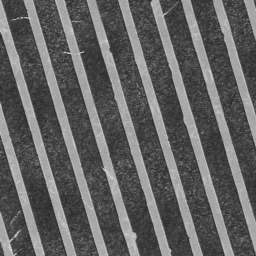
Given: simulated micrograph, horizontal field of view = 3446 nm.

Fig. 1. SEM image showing parallel lines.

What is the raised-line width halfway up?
0.111 micrometres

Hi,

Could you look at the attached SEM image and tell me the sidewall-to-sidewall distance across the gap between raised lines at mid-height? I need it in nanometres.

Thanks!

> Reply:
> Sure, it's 292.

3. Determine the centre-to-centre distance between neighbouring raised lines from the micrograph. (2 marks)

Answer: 407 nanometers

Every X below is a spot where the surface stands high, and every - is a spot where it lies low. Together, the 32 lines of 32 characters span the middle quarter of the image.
---XX------XX-----XXX-----XX----
---XX------XX------XX------XX---
---XX------XX------XX------XX---
---XXX------XX-----XX------XX---
----XX------XX------XX-----XXX--
----XX------XX------XX------XX--
----XXX-----XXX-----XX------XX--
-----XX------XX-----XXX-----XXX-
-----XX------XX------XX------XX-
-----XX------XX------XX------XX-
------XX------XX-----XXX-----XX-
------XX------XX------XX------XX
------XX------XX------XX------XX
X-----XXX-----XXX-----XXX-----XX
X------XX------XX------XX-----XX
X------XX------XX------XX------X
XX-----XXX-----XXX-----XX------X
XX------XX------XX-----XXX-----X
XX------XX------XX------XX------
XX------XX------XXX-----XX------
-XX-----XXX------XX-----XX------
-XX------XX------XX------XX-----
-XX------XX------XX------XX-----
--XX-----XX------XXX-----XX-----
--XX------XX------XX------XX----
--XX------XX------XX------XX----
--XXX-----XX------XX------XX----
---XX------XX------XX-----XXX---
---XX------XX------XX------XX---
---XX------XX------XX------XX---
----XX-----XXX-----XXX-----XX---
----XX------XX------XX------XX--